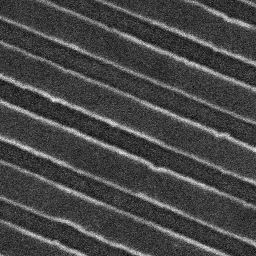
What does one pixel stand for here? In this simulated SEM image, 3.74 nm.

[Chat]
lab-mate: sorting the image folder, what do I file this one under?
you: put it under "parallel lines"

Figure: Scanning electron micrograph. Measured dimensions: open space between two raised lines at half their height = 78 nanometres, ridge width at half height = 33.1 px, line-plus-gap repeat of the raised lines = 206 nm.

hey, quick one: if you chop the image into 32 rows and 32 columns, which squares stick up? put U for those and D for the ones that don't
UUUUUUDDDDDDDUUUUUUUUUUUUDDDDDDU
UUUUUUUUUDDDDDDDUUUUUUUUUUUDDDDD
DUUUUUUUUUUDDDDDDDUUUUUUUUUUUDDD
DDDUUUUUUUUUUDDDDDDDDUUUUUUUUUUU
DDDDDDUUUUUUUUUUDDDDDDDUUUUUUUUU
UDDDDDDDUUUUUUUUUUDDDDDDDUUUUUUU
UUUDDDDDDDUUUUUUUUUUUDDDDDDDUUUU
UUUUUUDDDDDDDUUUUUUUUUUDDDDDDDUU
UUUUUUUUDDDDDDDUUUUUUUUUUUDDDDDD
UUUUUUUUUUDDDDDDDDUUUUUUUUUUDDDD
DDUUUUUUUUUUUDDDDDDDUUUUUUUUUUDD
DDDDDUUUUUUUUUUDDDDDDDDUUUUUUUUU
DDDDDDUUUUUUUUUUUDDDDDDDDUUUUUUU
UUDDDDDDDUUUUUUUUUUUDDDDDDDUUUUU
UUUUUDDDDDDUUUUUUUUUUUDDDDDDDDUU
UUUUUUUDDDDDDDUUUUUUUUUUUDDDDDDD
UUUUUUUUUUDDDDDDUUUUUUUUUUUDDDDD
UUUUUUUUUUUUDDDDDDDUUUUUUUUUUUDD
DDDUUUUUUUUUUUUDDDDDDUUUUUUUUUUU
DDDDDUUUUUUUUUUUUDDDDDDDUUUUUUUU
UDDDDDDUUUUUUUUUUUUDDDDDDDUUUUUU
UUUUDDDDDDUUUUUUUUUUUUDDDDDDUUUU
UUUUUUDDDDDDDUUUUUUUUUUUDDDDDDDU
UUUUUUUUDDDDDDDUUUUUUUUUUUDDDDDD
UUUUUUUUUUUDDDDDDUUUUUUUUUUUUDDD
DDUUUUUUUUUUUDDDDDDDUUUUUUUUUUUD
DDDDUUUUUUUUUUUDDDDDDDUUUUUUUUUU
DDDDDDDUUUUUUUUUUUDDDDDDUUUUUUUU
UUDDDDDDDDUUUUUUUUUUDDDDDDDUUUUU
UUUUUDDDDDDDUUUUUUUUUUDDDDDDDUUU
UUUUUUUUDDDDDDUUUUUUUUUUUDDDDDDD
UUUUUUUUUUDDDDDDUUUUUUUUUUUUDDDD